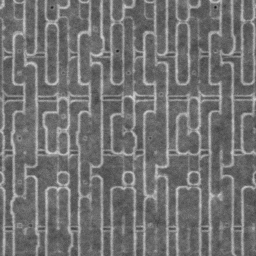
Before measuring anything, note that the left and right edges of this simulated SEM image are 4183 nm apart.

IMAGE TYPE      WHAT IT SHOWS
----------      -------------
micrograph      wiring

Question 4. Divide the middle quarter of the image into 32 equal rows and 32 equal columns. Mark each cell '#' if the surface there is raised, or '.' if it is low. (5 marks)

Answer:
....#####...###.....######..###.
....#####...###.....######..###.
....#####...###.....######..###.
....#####...###.....######..###.
....#####...###.....######..###.
......###..............###......
.......##..............###......
.......##..............#.#......
.......##......##......###......
#......##......##......###.....#
#......##......##......###.....#
#......##......##......###.....#
#...#####......###..######.....#
#...#####...######..######..####
#...#####...######..######..####
#...#####...######..######..####
....#####...#####...######..####
#..######...#####...######..####
#..######...######..######..####
#..######...######..######..####
#...#####...######..######..####
#...#####...#####...######..####
#...#####......##...######......
....#####...........######......
....#####...........######......
....#####...........######......
....###.............###.........
#...###........##...###........#
#...#####......##...######.....#
#...#####......##...######.....#
#...#####...........######......
#...#####...######..######..####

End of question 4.